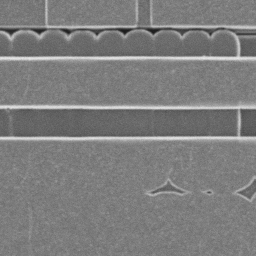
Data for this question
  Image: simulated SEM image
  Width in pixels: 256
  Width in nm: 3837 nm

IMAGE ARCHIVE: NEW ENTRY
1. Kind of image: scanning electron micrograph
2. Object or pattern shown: wiring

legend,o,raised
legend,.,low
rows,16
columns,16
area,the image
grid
................
................
................
................
oooooooooooooooo
oooooooooooooooo
oooooooooooooooo
................
................
oooooooooooooooo
oooooooooooooooo
oooooooooooooooo
oooooooooooooooo
oooooooooooooooo
oooooooooooooooo
oooooooooooooooo